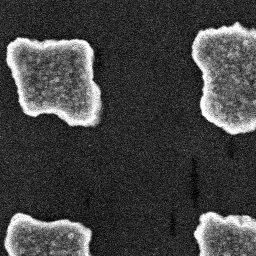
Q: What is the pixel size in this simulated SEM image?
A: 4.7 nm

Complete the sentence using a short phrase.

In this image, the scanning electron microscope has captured raised bodies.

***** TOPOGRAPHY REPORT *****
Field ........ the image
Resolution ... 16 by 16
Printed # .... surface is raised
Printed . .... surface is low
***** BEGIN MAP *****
................
................
............####
.#####......####
.#####.......###
.#####.......###
.#####.......###
....##.......###
................
................
................
................
................
................
.####.......####
#####........###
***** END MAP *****